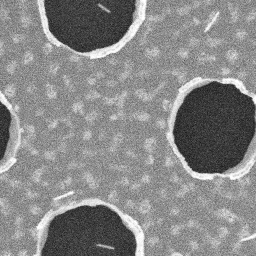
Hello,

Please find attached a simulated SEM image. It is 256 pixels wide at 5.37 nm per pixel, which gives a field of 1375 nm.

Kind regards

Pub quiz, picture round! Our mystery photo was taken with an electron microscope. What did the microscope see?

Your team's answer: holes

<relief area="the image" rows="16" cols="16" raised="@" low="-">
@@@------@@@@@@@
@@@-----@@@@@@@@
@@@@---@@@@@@@@@
@@@@@@@@@@@@@@@@
@@@@@@@@@@@@@@@@
@@@@@@@@@@@@---@
@@@@@@@@@@@-----
-@@@@@@@@@@-----
-@@@@@@@@@@-----
-@@@@@@@@@@-----
@@@@@@@@@@@@---@
@@@@@@@@@@@@@@@@
@@@@@@@@@@@@@@@@
@@@@----@@@@@@@@
@@@-----@@@@@@@@
@@-------@@@@@@@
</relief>